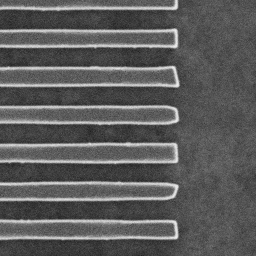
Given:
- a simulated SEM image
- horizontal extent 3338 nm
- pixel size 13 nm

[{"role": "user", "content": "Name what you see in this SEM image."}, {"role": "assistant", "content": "wiring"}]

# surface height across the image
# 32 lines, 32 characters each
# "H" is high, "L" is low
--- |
HHHHHHHHHHHHHHHHHHHHHHLLLLLLLLLL
LLLLLLLLLLLLLLLLLLLLLLLLLLLLLLLL
LLLLLLLLLLLLLLLLLLLLLLLLLLLLLLLL
LLLLLLLLLLLLLLLLLLLLLLLLLLLLLLLL
HHHHHHHHHHHHHHHHHHHHHHLLLLLLLLLL
HHHHHHHHHHHHHHHHHHHHHHLLLLLLLLLL
LLLLLLLLLLLLLLLLLLLLLLLLLLLLLLLL
LLLLLLLLLLLLLLLLLLLLLLLLLLLLLLLL
LLLLLLLLLLLLLLLLLLLLHHLLLLLLLLLL
HHHHHHHHHHHHHHHHHHHHHHLLLLLLLLLL
HHHHHHHHHHHHHHHHHHHHHHLLLLLLLLLL
LLLLLLLLLLLLLLLLLLLLLLLLLLLLLLLL
LLLLLLLLLLLLLLLLLLLLLLLLLLLLLLLL
HHHHHHHHHHHHHHHHHHHHHHLLLLLLLLLL
HHHHHHHHHHHHHHHHHHHHHHLLLLLLLLLL
LLLLLLLLLLLLLLLLLLLLLLLLLLLLLLLL
LLLLLLLLLLLLLLLLLLLLLLLLLLLLLLLL
LLLLLLLLLLLLLLLLLLLLLLLLLLLLLLLL
HHHHHHHHHHHHHHHHHHHHHHLLLLLLLLLL
HHHHHHHHHHHHHHHHHHHHHHLLLLLLLLLL
LLLLLLLLLLLLLLLLLLLLLLLLLLLLLLLL
LLLLLLLLLLLLLLLLLLLLLLLLLLLLLLLL
LLLLLLLLLLLLLLLLLLLLLLLLLLLLLLLL
HHHHHHHHHHHHHHHHHHHHHHLLLLLLLLLL
HHHHHHHHHHHHHHHHHHHHHHLLLLLLLLLL
LLLLLLLLLLLLLLLLLLLLLLLLLLLLLLLL
LLLLLLLLLLLLLLLLLLLLLLLLLLLLLLLL
LLLLLLLLLLLLLLLLLLLLLLLLLLLLLLLL
HHHHHHHHHHHHHHHHHHHHHHLLLLLLLLLL
HHHHHHHHHHHHHHHHHHHHHHLLLLLLLLLL
LLLLLLLLLLLLLLLLLLLLLLLLLLLLLLLL
LLLLLLLLLLLLLLLLLLLLLLLLLLLLLLLL